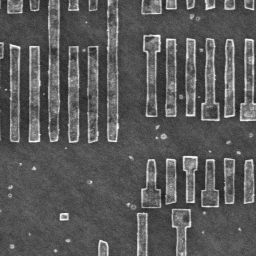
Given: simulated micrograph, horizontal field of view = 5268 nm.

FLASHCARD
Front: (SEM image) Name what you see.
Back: wiring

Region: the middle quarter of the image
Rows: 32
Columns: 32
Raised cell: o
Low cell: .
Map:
..o...oo...oo........oo...oo...o
.ooo..oo...oo........oo...oo...o
.ooo..oo...oo........oo...oo...o
.ooo..oo...oo........oo...oo...o
.ooo..oo...oo........oo...oo...o
.ooo..oo...oo........oo...oo...o
.ooo..oo...oo........oo...oo...o
.ooo..oo...oo........oo...oo...o
.ooo..oo...oo........oo...oo...o
.ooo..oo...oo........oo...oo...o
.ooo..oo...oo........oo...oo...o
.ooo..oo...oo........oo...oo...o
.ooo..oo...oo........oo...oo...o
.ooo..oo...oo...................
.ooo..oo...oo...................
.ooo..oo...oo...................
.ooo..oo...oo...................
.ooo..oo...oo...................
.oo...oo...oo...................
................................
................................
................................
................................
..............................oo
.....................oo...oo..oo
.....................oo...oo..oo
.....................oo...oo..oo
.....................oo...oo...o
.....................oo...oo...o
.....................oo...oo...o
.....................oo...oo...o
....................ooo...oo...o